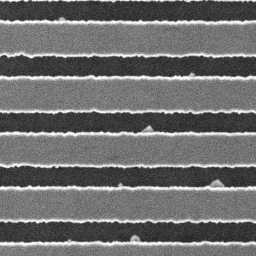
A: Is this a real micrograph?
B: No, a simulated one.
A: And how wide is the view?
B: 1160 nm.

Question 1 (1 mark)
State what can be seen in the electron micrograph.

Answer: lines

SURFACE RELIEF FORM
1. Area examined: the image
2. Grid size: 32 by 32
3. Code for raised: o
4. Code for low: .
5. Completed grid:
................................
................................
................................
oooooooooooooooooooooooooooooooo
oooooooooooooooooooooooooooooooo
oooooooooooooooooooooooooooooooo
oooooooooooooooooooooooooooooooo
................................
................................
...........o....................
oooooooooooooooooooooooooooooooo
oooooooooooooooooooooooooooooooo
oooooooooooooooooooooooooooooooo
oooooooooooooooooooooooooooooooo
................................
................................
................................
oooooooooooooooooooooooooooooooo
oooooooooooooooooooooooooooooooo
oooooooooooooooooooooooooooooooo
oooooooooooooooooooooooooooooooo
................................
................................
oooooooooooooooooooooooooooooooo
oooooooooooooooooooooooooooooooo
oooooooooooooooooooooooooooooooo
oooooooooooooooooooooooooooooooo
oooooooooooooooooooooooooooooooo
................................
................................
oooooooooooooooooooooooooooooooo
oooooooooooooooooooooooooooooooo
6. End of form